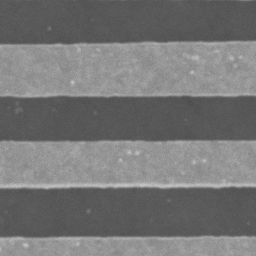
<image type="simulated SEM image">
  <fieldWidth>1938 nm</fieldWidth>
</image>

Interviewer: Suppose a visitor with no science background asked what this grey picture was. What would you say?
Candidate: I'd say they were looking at lines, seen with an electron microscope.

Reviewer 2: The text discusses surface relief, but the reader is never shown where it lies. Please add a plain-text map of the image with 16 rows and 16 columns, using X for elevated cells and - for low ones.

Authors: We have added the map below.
----------------
----------------
----------------
XXXXXXXXXXXXXXXX
XXXXXXXXXXXXXXXX
XXXXXXXXXXXXXXXX
----------------
----------------
----------------
XXXXXXXXXXXXXXXX
XXXXXXXXXXXXXXXX
XXXXXXXXXXXXXXXX
----------------
----------------
----------------
XXXXXXXXXXXXXXXX